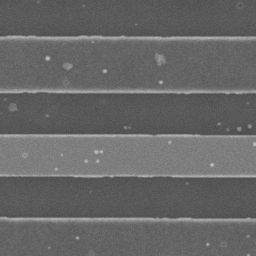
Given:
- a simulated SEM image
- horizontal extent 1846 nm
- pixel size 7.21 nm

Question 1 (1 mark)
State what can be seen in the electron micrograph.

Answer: lines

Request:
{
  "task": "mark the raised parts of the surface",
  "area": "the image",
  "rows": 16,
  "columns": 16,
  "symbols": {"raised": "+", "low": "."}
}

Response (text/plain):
................
................
++++++++++++++++
++++++++++++++++
++++++++++++++++
++++++++++++++++
................
................
+++++++++++++...
++++++++++++++++
++++++++++++++++
................
................
................
++++++++++++++++
++++++++++++++++